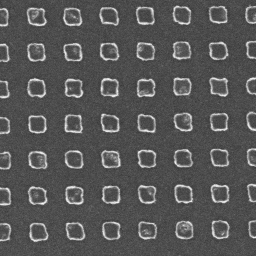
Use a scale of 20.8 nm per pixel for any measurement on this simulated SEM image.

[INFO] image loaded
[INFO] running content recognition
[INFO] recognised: a regular array of raised bodies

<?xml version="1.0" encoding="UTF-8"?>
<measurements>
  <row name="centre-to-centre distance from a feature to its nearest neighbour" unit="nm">736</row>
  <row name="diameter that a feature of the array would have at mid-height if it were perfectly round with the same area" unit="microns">0.378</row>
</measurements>